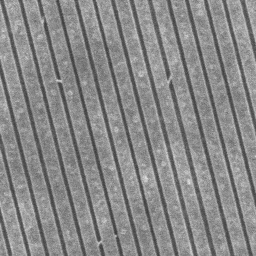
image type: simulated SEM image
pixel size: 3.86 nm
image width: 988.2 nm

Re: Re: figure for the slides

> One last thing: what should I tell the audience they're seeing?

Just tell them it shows parallel lines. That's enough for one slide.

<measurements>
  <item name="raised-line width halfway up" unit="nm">53.3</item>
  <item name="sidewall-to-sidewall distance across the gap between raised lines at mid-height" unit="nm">15.5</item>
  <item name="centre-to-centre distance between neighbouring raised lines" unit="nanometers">69.2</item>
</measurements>